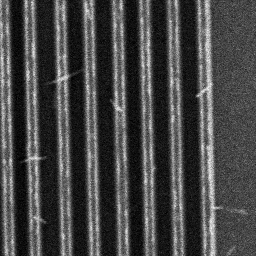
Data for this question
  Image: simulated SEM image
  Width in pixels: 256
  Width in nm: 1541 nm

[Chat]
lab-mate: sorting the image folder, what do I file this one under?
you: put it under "parallel lines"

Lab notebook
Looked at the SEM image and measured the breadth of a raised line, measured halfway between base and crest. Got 64.7 nm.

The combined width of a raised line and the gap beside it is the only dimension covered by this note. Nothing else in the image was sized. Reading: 0.172 um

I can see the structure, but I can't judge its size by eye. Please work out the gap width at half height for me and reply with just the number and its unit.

106 nm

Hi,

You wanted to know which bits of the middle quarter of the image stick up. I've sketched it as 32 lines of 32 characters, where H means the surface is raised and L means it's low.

HLLLLHHHLLLLLHHLLLLHHHLLLLHHHLLL
HLLLLHHHLLLLLHHLLLLHHHLLLLHHHLLL
HLLLLHHHLLLLLHHLLLLHHHLLLLHHHLLL
HLLLLHHHLLLLLHHLLLLHHHLLLLHHHLLL
HLLLLHHHLLLLLHHLLLLHHHLLLLHHHLLL
HLLLLHHHLLLLLHHLLLLHHHLLLLHHHLLL
HLLLLHHHLLLLLHHLLLLHHHLLLLHHHLLL
HLLLLHHHLLLLLHHLLLLHHHLLLLHHHLLL
HLLLLHHHLLLLLHHLLLLHHHLLLLHHHLLL
HLLLLHHHLLLLHHHLLLLHHHLLLLHHHLLL
HLLLLHHHLLLLLHHLLLLHHHLLLLHHHLLL
HLLLLLHHLLLLLHHLLLLHHHLLLLLHHLLL
HLLLLLHHLLLLLHHLLLLHHHLLLLLHHLLL
HLLLLLHHLLLLLHHLLLLHHHLLLLLHHLLL
HLLLLLHHLLLLLHHLLLLLHHLLLLLHHLLL
HLLLLLHHLLLLLHHLLLLLHHLLLLLHHLLL
HLLLLLHHLLLLLHHLLLLLHHLLLLLHHLLL
HLLLLLHHLLLLLHHLLLLLHHLLLLLHHLLL
HLLLLLHHLLLLLHHLLLLLHHLLLLLHHLLL
HLLLLLHHLLLLLHHLLLLLHHLLLLLHHLLL
HLLLLLHHLLLLLHHHLLLLHHLLLLLHHLLL
HLLLLLHHLLLLLHHHLLLLHHLLLLLHHLLL
HLLLLLHHLLLLLHHHLLLLHHLLLLLHHLLL
HLLLLLHHLLLLLHHHLLLLHHLLLLLHHHLL
HLLLLLHHLLLLLHHHLLLLHHLLLLLHHHLL
HLLLLLHHLLLLLHHHLLLLHHLLLLLHHHLL
HLLLLLHHLLLLLHHHLLLLHHLLLLLHHHLL
HLLLLLHHLLLLLHHHLLLLHHLLLLLHHHLL
HHLLLLHHLLLLLHHHLLLLHHLLLLLHHHLL
HHLLLLHHLLLLLHHHLLLLHHLLLLLHHHLL
HHLLLLHHLLLLLHHHLLLLHHLLLLLHHHLL
HHLLLLHHLLLLLHHHLLLLHHLLLLLHHHLL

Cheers